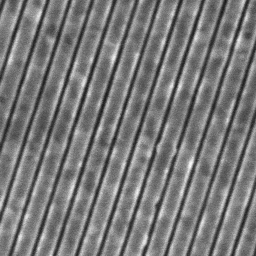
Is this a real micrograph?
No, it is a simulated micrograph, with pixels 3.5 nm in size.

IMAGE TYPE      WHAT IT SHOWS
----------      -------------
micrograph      parallel lines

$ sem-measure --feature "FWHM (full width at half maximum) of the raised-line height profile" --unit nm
55.8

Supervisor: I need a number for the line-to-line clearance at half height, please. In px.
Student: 5.11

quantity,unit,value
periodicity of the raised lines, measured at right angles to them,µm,0.074